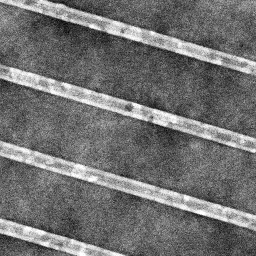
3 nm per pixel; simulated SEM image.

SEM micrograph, one or a few lines or trenches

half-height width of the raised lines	31.4	nanometres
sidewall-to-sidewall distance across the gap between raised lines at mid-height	0.19	µm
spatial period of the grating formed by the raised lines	222	nm